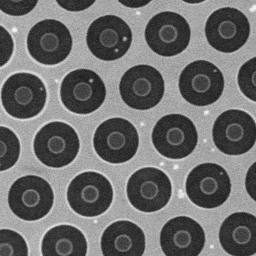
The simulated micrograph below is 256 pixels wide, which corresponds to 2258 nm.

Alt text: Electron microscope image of an array of small figures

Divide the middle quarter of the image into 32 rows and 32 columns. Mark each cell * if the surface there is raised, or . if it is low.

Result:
*****************.....*********.
***....*********.......*******..
*.......*******.........*****...
.........*****...........****...
..........****....***....****...
...***....****...*****...***....
...****...****...****....****...
...****....***....***....****...
...***....****...........*****..
..........*****.........*******.
.........*******.......*********
*.......**********...***********
***...********************...***
************...*********.......*
*********........******.........
..******..........****..........
...*****..........****.....**...
...****.....**.....***....****..
....***....****....***....****..
....***....****....***....***...
....***....****....***..........
....****..........*****.........
...*****..........******........
...******........*********....**
..*********.....****************
.*******************************
******************.......*******
****.....********.........*****.
**.........*****..........*****.
**..........****...........***..
*...........***.....***....***..
*....***....***....****....***..